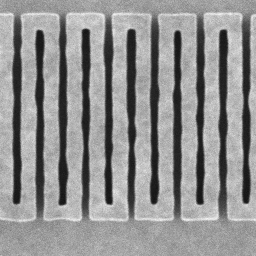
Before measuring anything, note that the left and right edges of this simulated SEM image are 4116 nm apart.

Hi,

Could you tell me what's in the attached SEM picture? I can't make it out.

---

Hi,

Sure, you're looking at groups of lines, slits or small figures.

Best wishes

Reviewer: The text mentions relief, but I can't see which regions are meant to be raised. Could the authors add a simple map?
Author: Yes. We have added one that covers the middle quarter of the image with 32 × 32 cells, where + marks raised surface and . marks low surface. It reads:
.+++...+++..+++...++++..+++..+++
.+++...+++..+++...++++..+++...++
.++++..+++..+++...++++..+++...++
.++++..+++..+++...++++..+++...++
.+++...+++..+++...++++..+++..+++
.+++...+++..+++...++++..+++..+++
.+++..++++..+++...+++...+++..+++
.++++.++++..+++...+++...+++...++
.++++..+++..+++...+++...+++...++
.+++...+++..+++...+++...+++...++
.+++...+++..+++...+++...+++...++
.++++..+++..+++...+++...+++...++
.+++...+++..++++..+++...+++...++
.+++...+++..++++..++++..+++...++
.+++...+++..++++..++++..+++...++
.+++...+++..++++..++++..+++...++
.+++...+++..++++..++++..+++...++
.++++..+++..++++..++++..+++...++
.++++.++++..++++..++++..+++...++
.++++.++++..++++..++++..+++...++
.++++.++++..++++..++++..+++...++
.++++.++++..++++..++++..+++...++
.++++.++++..++++..++++..+++...++
.++++..+++..++++..++++..+++...++
.++++.++++..++++..++++..+++...++
.+++..++++..++++..++++..+++...++
.+++...+++..++++..++++..+++...++
.+++...+++..++++..++++..+++...++
.+++...+++..++++..++++..+++...++
.+++...+++..++++..++++..+++...++
.+++...+++..++++..+++...+++..+++
.+++...+++..++++..+++...+++..+++